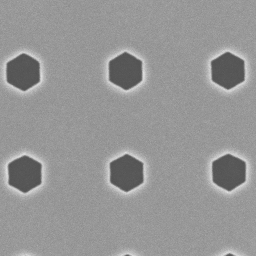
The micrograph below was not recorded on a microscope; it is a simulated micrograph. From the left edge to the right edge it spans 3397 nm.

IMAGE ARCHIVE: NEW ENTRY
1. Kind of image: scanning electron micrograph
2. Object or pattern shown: holes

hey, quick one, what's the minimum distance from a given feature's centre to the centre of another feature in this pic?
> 102 px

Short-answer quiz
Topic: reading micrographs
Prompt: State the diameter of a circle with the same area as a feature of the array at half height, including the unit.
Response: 473 nanometres